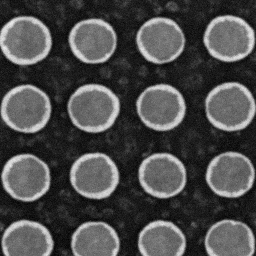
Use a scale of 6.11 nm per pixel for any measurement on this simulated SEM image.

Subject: a regular array of raised bodies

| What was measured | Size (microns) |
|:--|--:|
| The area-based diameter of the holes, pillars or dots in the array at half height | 0.278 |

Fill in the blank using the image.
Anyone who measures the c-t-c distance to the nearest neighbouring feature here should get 0.413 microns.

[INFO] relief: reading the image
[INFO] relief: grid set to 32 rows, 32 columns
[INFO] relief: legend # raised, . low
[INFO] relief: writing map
................................
................................
..##.......#.......##......###..
.#####...#####....####....#####.
######...#####...######...######
######...#####...######...######
.#####...#####....####....#####.
..###......##......##.......#...
................................
................................
................................
.####.....####....####.....####.
.#####...#####....#####...######
######...######..######...######
######...#####....#####...######
.####.....####....####.....####.
................................
................................
................................
..##.......##......##.......##..
.####....#####....#####...#####.
.#####...######...#####...######
######...######...#####...######
.#####...#####....#####....####.
..###......##.......#...........
................................
................................
................................
.####.....####....####.....####.
.#####...#####....#####...#####.
######...######..######...######
.#####...######...#####...######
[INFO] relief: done